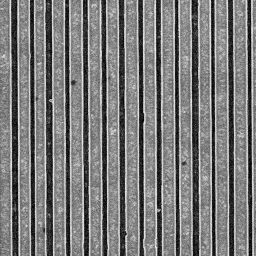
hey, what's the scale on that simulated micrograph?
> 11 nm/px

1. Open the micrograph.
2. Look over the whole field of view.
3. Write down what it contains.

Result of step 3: parallel lines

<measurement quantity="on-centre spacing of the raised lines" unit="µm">0.198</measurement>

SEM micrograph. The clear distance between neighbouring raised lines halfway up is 0.063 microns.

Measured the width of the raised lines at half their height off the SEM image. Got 136 nm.